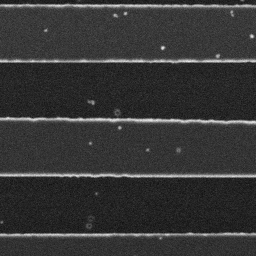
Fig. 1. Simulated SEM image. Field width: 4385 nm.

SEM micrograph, lines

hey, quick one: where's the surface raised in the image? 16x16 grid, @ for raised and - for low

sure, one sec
@@@@@@@@@@@@@@@@
@@@@@@@@@@@@@@@@
@@@@@@@@@@@@@@@@
@@@@@@@@@@@@@@@@
----------------
----------------
----------------
@@@@@@@---------
@@@@@@@@@@@@@@@@
@@@@@@@@@@@@@@@@
@@@@@@@@@@@@@@@@
----------------
----------------
----------------
----------------
@@@@@@@@@@@@@@@@